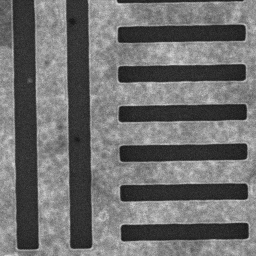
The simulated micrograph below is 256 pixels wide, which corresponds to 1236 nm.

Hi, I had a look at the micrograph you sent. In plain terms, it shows groups of lines, slits or small figures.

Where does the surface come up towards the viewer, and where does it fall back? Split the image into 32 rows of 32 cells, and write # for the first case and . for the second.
#...####...####..#.#############
#...####...#####################
#...####...#####################
##..####...####................#
##..####...####................#
##..####...#####.###############
##..####...#####################
##..####...#####################
##...###...####................#
##...###...####................#
##...###...#####################
##...###...#####################
##...###...#####################
##...###...####................#
##...###...####................#
##...###...#####################
##...###...#####################
##...###...#####################
##...###...####................#
##...####..####................#
##...####..#####################
##...####..#####################
##...####...####################
##...####..####................#
##...####..####................#
##...####...####################
##...####...####################
##...####...####################
##...####...###................#
##...####...###................#
##...####...####################
################################